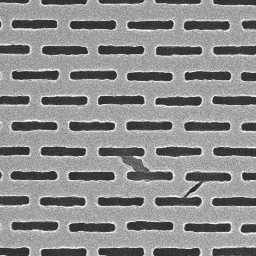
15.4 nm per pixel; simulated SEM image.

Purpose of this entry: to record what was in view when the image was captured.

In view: a regular array of holes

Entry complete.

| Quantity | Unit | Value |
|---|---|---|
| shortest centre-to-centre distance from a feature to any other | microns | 0.581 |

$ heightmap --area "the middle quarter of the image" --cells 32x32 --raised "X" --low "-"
XXXXXXXXXXXXXXXXXXXXXXXXXXXXXXXX
XXXXXXXXXXXXXXXXXXXXXXXXXXXXXXXX
XX-----------XXX-----------XXX--
XX-----------XXX-----------XXX--
XXXXXXXXXXXXXXXXXXXXXXXXXXXXXXXX
XXXXXXXXXXXXXXXXXXXXXXXXXXXXXXXX
XXXXXXXXXXXXXXXXXXXXXXXXXXXXXXXX
XXXXXXXXXXXXXXXXXXXXXXXXXXXXXXXX
------XXX-----------XXXX--------
------XX------------XXX---------
XXXXXXXXXXXXXXXXXXXXXXXXX-------
XXXXXXXXXXXXXXXXXXXXXXXXXXXXXXXX
XXXXXXXXXXXXXXXXXXXXXXXXXXXXXXXX
XXXXXXXXXXXXXXXXXXXXXXXXXXXXXXXX
XX---XX--XXXXXXX-----------XXXX-
X------------XX------------XXX--
XX----------XXXX----------XXXX--
XXXXXXXXXXXXXXXXXXXXXXXXXXXXXXXX
XXXXXXXXXXXXXXXXXXXXXXXXXXXXXXXX
XXXXXXXXXXXXXXXXXXXXXXXXXXXXXXXX
XXXXXXXXXXXXXXXXXXXXXXXXXXXXXXXX
-----XXXX-----------XXX---------
-----XXXX-----------XXX---------
XXXXXXXXXXXXXX----XXXXXXXXXXXXXX
XXXXXXXXXXXXXXX-----XXXXXXXXXXXX
XXXXXXXXXXXXXXXX----XXXXXXXXXXXX
XXXXXXXXXXXXXXXXX----XXXXXXXXXXX
X-----------XXXX-----------XXXX-
X------------XXX-----------XXX--
XXXXXXXXXXXXXXXXXXXXXXXXXXXXXXX-
XXXXXXXXXXXXXXXXXXXXXXXXXXXXXXXX
XXXXXXXXXXXXXXXXXXXXXXXXXXXXXXX-